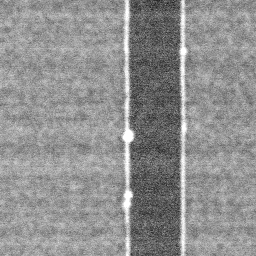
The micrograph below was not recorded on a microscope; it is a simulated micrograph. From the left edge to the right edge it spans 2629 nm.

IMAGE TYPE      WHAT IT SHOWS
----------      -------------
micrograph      one or a few lines or trenches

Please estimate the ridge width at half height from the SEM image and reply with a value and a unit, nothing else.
576 nanometers